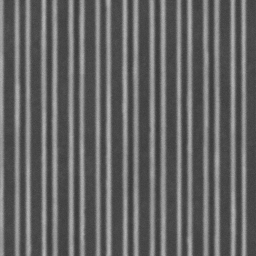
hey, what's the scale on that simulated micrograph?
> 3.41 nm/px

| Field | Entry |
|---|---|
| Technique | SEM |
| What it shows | parallel lines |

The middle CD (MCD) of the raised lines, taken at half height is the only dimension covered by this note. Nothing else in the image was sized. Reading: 0.0153 microns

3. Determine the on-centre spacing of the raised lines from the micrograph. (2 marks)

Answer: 45.4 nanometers